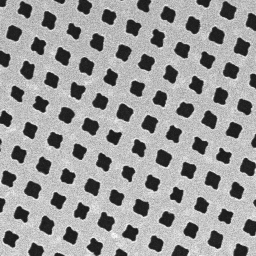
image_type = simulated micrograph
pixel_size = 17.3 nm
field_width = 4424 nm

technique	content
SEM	a regular array of holes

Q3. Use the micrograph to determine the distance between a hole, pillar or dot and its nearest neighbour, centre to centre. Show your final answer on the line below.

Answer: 453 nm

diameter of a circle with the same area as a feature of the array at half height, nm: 263